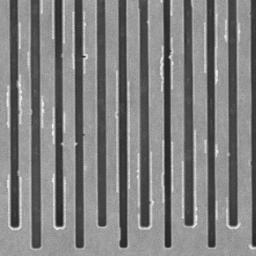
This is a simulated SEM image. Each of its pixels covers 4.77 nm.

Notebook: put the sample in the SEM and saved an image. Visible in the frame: parallel lines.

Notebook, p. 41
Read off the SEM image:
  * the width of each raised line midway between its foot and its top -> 67.3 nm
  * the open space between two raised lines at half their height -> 38.1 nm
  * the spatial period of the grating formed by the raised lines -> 105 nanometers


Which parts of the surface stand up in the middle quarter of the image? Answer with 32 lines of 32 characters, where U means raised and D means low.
UUUDDUUUDDUUUUDDUUUDDUUUUDDUUUDD
UUUDDUUUDDUUUUDDUUUDDUUUUDDUUUDD
UUUDDUUUDDUUUUDDUUUDDUUUUDDUUUDD
UUUDDUUUDDDUUUDDUUUDDUUUUDDUUUDD
UUUDDUUUDDDUUUDDUUUDDUUUUDDUUUDD
UUUDDUUUDDDUUUDDUUUDDUUUUDDUUUDD
UUUDDUUUDDDUUUDDUUUDDUUUUDDUUUDD
UUUDDUUUDDDUUUDDUUUDDUUUUDDUUUDD
UUUDDUUUDDDUUUDDUUUDDUUUUDDUUUDD
UUUDDUUUDDDUUUDDUUUDDUUUUDDUUUDD
UUUDDUUUDDDUUUDDUUUDDUUUUDDUUUDD
UUUDDUUUDDDUUUDDUUUDDUUUUDDUUUDD
UUUDDUUUDDDUUUDDUUUDDUUUUDDUUUDD
UUUDDUUUDDDUUUDDUUUDDUUUUDDUUUDD
UUUDDUUUDDDUUUDDUUUDDUUUUDDUUUDD
UUUDDUUUDDDUUUDDUUUDDUUUUDDUUUDD
UUUDDUUUDDDUUUDDUUUDDUUUUDDUUUDD
UUUDDUUUDDDUUUDDUUUDDUUUUDDUUUDD
UUUDDUUUDDDUUUDDUUUDDUUUUDDUUUDD
UUUDDUUUDDDUUUDDUUUDDUUUUDDUUUDD
UUUDDUUUDDDUUUDDUUUDDUUUUDDUUUDD
UUUDDUUUDDDUUUDDUUUDDUUUUDDUUUDD
UUUDDUUUDDDUUUDDUUUDDUUUUDDUUUDD
UUUDDUUUDDDUUUDDUUUDDUUUUDDUUUDD
UUUDDUUUDDDUUUDDUUUDDUUUUDDUUUDD
UUUDDUUUDDDUUUDDUUUDDUUUUDDUUUDD
UUUDDUUUDDDUUUDDUUUDDUUUUDDUUUDD
UUUDDUUUDDDUUUDDUUUDDUUUUDDUUUDD
UUUDDUUUDDDUUUDDUUUDDUUUUDDUUUDD
UUUDDUUUDDDUUUDDUUUDDUUUUDDUUUDD
UUUDDUUUDDDUUUDDUUUDDUUUUDDUUUDD
UUUDDUUUDDDUUUDDUUUDDUUUUDDUUUDD